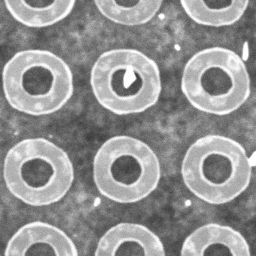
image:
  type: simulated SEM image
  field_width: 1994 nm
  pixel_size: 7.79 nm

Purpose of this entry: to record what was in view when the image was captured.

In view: ring-shaped raised bodies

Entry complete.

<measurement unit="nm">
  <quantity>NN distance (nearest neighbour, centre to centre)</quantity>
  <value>692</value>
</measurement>